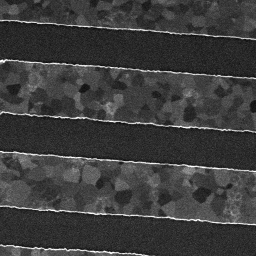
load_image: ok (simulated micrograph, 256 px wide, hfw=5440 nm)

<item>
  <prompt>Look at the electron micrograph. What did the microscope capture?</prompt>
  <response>one or a few lines or trenches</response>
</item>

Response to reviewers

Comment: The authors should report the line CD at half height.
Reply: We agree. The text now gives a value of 53.9 pixels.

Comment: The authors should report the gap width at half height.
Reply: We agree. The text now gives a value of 0.821 µm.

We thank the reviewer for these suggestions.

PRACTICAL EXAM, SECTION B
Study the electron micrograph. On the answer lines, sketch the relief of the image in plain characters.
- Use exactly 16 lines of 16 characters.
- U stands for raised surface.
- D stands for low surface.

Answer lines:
UUUUUUUUUUUUUUUU
DDDUUUUUUUUUUUUU
DDDDDDDDDDDDDDDD
DDDDDDDDDDDDDDDD
UUUUUUUUUUDDDDDD
UUUUUUUUUUUUUUUU
UUUUUUUUUUUUUUUU
DDDDDDUUUUUUUUUU
DDDDDDDDDDDDDDDD
DDDDDDDDDDDDDDDD
UUUUUUUUUUUUUDDD
UUUUUUUUUUUUUUUU
UUUUUUUUUUUUUUUU
DDDDDDDDDUUUUUUU
DDDDDDDDDDDDDDDD
UUDDDDDDDDDDDDDD